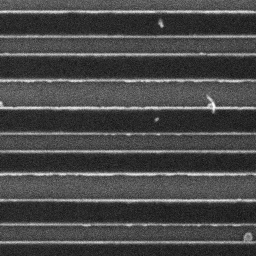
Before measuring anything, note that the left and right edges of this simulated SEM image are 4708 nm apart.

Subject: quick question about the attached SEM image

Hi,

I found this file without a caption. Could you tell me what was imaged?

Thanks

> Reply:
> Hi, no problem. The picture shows lines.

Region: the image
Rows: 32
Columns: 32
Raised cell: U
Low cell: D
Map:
DDDDDDDDDDDDDDDDDDDDDDDDDDDDDDDD
UUUUUUUUUUUUUUUUUUUUUUUUUUUUUUUU
UUUUUUUUUUUUUUUUUUUUUUUUUUUUUUUU
UUUUUUUUUUUUUUUUUUUUUUUUUUUUUUUU
UUUUUUUUUUUUUUUUUUUUUUUUUUUUUUUU
DDDDDDDDDDDDDDDDDDDDDDDDDDDDDDDD
DDDDDDDDDDDDDDDDDDDDDDDDDDDDDDDD
UUUUUUUUUUUUUUUUUUUUUUUUUUUUUUUU
UUUUUUUUUUUUUUUUUUUUUUUUUUUUUUUU
UUUUUUUUUUUUUUUUUUUUUUUUUUUUUUUU
DDDDDDDDDDDDDDDDDDDDDDDDDDDDDDDD
DDDDDDDDDDDDDDDDDDDDDDDDDDDDDDDD
DDDDDDDDDDDDDDDDDDDDDDDDDDDDDDDD
UUUUUUUUUUUUDUUUDUUUUUUUUUUUUUUU
UUUUUUUUUUUUUUUUUUUUUUUUUUUUUUUU
UUUUUUUUUUUUUUUUUUUUUUUUUUUUUUUU
UUUUUUUUUUUUUUUUUUUUUUUUUUUUUUUU
DDDDDDDDDDDDDDDDDDDDDDDDDDDDDDDD
DDDDDDDDDDDDDDDDDDDDDDDDDDDDDDDD
UUUUUUUUUUUUUUUUUUUUUUUUUUUUUUUU
UUUUUUUUUUUUUUUUUUUUUUUUUUUUUUUU
UUUUUUUUUUUUUUUUUUUUUUUUUUUUUUUU
DDDDDDDDDDDDDDDDDDDDDDDDDDDDDDDD
DDDDDDDDDDDDDDDDDDDDDDDDDDDDDDDD
DDDDDDDDDDDDDDDDDDDDDDDDDDDDDDDD
UUUUUUUUUUUUUUUUUUUUUUUUUUUUUUUU
UUUUUUUUUUUUUUUUUUUUUUUUUUUUUUUU
UUUUUUUUUUUUUUUUUUUUUUUUUUUUUUUU
DDDDDDDDDDDDDDDDDDDDDDDDDDDDDDDD
DDDDDDDDDDDDDDDDDDDDDDDDDDDDDDDD
UUUUUUUUUUUUUUUUUUUUUUUUUUUUUUUU
UUUUUUUUUUUUUUUUUUUUUUUUUUUUUUUU